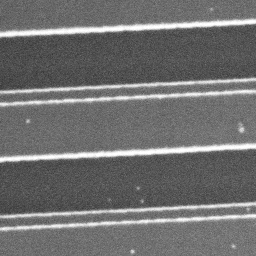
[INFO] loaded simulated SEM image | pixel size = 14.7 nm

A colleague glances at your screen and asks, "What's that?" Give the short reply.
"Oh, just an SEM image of lines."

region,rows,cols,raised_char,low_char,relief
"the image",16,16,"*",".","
****************
***************.
................
................
................
......**********
****************
****************
****************
***********.....
................
................
................
.***************
****************
****************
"